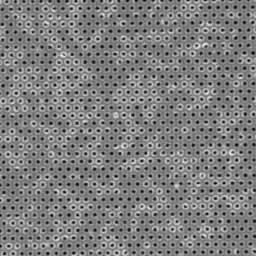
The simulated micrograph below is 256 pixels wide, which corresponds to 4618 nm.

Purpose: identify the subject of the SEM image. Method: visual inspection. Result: a regular array of holes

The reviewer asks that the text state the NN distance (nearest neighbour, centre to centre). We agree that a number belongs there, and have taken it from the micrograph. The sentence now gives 148 nanometers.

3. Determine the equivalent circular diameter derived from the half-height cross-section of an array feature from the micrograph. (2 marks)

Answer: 0.0761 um